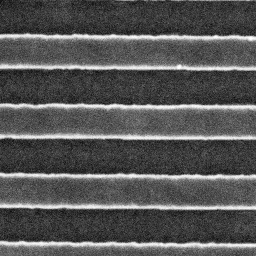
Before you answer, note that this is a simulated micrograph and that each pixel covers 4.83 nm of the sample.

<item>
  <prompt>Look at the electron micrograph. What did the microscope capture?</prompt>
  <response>lines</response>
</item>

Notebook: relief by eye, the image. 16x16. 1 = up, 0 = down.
0000000000000000
0000000000000000
1111111111111111
1111111111111111
0000000000000000
0000000000000000
0000000000000000
1111111111111111
1111111111111111
0000000000000000
0000000000000000
1111111111111111
1111111111111111
0000000000000000
0000000000000000
1111111111111111